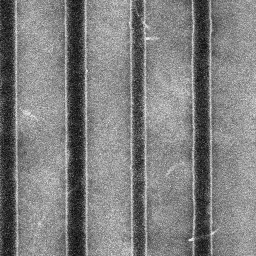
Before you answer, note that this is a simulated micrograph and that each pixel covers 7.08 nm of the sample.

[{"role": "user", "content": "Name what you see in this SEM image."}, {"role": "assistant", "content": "one or a few lines or trenches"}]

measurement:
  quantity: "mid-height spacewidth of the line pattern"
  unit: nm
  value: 333